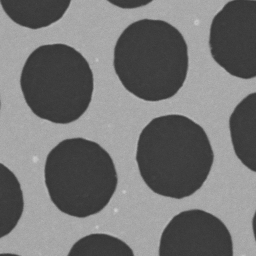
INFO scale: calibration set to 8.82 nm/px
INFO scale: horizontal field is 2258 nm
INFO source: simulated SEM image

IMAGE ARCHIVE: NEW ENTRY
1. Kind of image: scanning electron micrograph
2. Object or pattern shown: holes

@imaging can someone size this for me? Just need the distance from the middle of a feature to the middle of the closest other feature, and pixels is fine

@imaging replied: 96.5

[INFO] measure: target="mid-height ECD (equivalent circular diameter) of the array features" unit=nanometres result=684